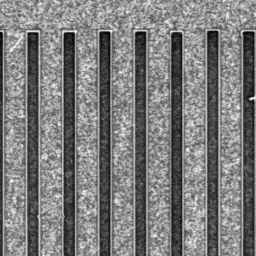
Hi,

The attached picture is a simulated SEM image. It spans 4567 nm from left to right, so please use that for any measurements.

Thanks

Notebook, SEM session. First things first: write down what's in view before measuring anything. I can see parallel lines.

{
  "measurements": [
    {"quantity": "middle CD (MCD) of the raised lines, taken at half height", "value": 0.428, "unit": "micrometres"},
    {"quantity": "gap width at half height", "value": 223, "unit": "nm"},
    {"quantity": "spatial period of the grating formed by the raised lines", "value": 640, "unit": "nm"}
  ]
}